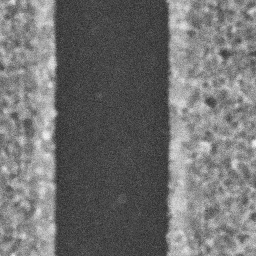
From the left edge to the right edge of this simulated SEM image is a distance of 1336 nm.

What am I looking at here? one or a few lines or trenches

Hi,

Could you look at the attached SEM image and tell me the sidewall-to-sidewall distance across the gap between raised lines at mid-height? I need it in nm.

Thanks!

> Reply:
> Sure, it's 709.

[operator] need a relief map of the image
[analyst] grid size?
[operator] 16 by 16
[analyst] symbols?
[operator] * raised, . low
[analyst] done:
***........*****
***........*****
***........*****
***........*****
***........*****
***........*****
***........*****
***........*****
***........*****
***........*****
***........*****
***........*****
***........*****
***........*****
***........*****
***........*****